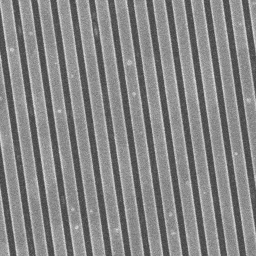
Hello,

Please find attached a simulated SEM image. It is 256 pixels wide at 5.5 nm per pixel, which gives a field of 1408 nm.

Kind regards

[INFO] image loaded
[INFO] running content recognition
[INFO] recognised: parallel lines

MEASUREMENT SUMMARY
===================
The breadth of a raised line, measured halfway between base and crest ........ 66.1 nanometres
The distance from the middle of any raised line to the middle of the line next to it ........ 104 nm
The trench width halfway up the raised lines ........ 0.0381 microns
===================